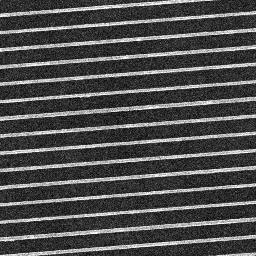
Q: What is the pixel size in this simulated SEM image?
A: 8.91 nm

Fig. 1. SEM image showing parallel lines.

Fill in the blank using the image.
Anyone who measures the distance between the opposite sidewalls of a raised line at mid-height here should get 26.6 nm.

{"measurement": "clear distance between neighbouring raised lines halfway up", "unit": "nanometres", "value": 121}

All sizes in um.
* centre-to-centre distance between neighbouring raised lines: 0.153